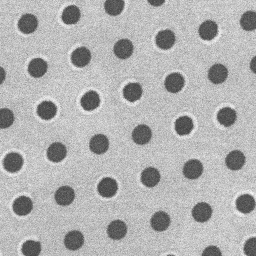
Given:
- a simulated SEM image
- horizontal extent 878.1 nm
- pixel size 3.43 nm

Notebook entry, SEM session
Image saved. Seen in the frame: a regular array of holes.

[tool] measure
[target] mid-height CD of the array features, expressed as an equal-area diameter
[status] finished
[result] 0.0719 microns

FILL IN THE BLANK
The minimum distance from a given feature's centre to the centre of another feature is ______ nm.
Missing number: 148